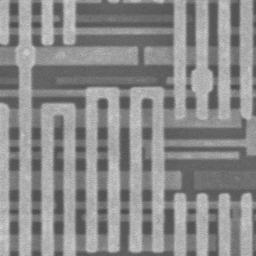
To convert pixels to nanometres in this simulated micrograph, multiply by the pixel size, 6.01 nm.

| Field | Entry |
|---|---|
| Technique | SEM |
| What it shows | wiring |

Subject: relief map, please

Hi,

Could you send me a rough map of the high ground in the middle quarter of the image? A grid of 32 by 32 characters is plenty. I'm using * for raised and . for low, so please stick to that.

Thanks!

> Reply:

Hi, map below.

............................**..
............................**..
............................**..
............................**..
............................**..
............................**..
......*******....********...**..
......*******....********...**..
......***.***....***.****...**..
......**...**....**...***...**..
**...***...**....**...**....**..
**...***...**....**...**....**..
***..***...***...**...***...**..
***..***...***...**...***...*...
***..***...***...**...***.......
**...***...***...**...***.......
**...***...***..***...***.......
**....**...***..***...***.......
**....**...***..***...***.......
**....**...***...**...***.......
**....**...***...**...***.......
**....**...***...**...***.......
**....**...***...**...***.......
**....**...***...**...***.......
**....**...***...**...***.......
**....**...***...**...***.......
**....**...***...**...***.......
***...**...***...**...***.......
***...**...***...**...***.......
***...**...***...**...***.......
***...**...***...**...***.......
***...**...***...**...***.......